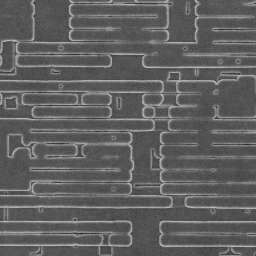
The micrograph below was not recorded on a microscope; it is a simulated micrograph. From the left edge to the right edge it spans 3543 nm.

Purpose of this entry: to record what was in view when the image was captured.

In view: wiring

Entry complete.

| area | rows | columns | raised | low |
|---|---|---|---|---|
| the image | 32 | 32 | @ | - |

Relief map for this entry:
@@@@-----@@@@@--@@@@@---@@@@@@@@
@@@@-----@@@@@@@@@@@@---@@@@@@@@
@@@@-----@@@@@@@@@@@@---@@@@@@@@
@@@@-----@@@@@@@@@@@@---@@@@@@@@
@@@@-----@@@@@@@@@@@@---@@@@@@@@
--@@@@@@@@@@@@@@@@@@@@@@@@@@@@@@
--@@@@@@@@@@@@@@@@@@@@@@@@@@@@@@
--@@@@@@@@@@@@----@@@@@@@@@@@@@@
--------------------------------
------------------------------@@
@@@@@@@@@@@@@@@@@@@@--@@@@@@@@@@
@@@@@@@@@@@@@@@@@@@@--@@@@@@@@@@
---@@@@@@@@@@@----@@--@@@@@@@@@@
----@@@@@@@@@@----@--@@@@@@@@@@@
----@@@@@@@@@@----@--@@@@@@@@@@@
@@@@@@@@@@@@@@@@@@@--@@@@@@@@@@@
@@@@@@@@@@@@@@@@@----@@@@@@@@@@@
@--@@@@@@@@@@@@@----@@@@@@@@@@@@
@-@@@@@@@@@@@@@@----@@@@@@@@@@@@
@@@@@@@@@@@@@@@@----@@@@@@@@@@@@
@@@@@@@@@@@@@@@@@---@@@@@@@@@@@@
@@@@@@@@@@@@@@@@----@@@@@@@@@@@@
@@@@@@@@@@@@@@@@----@@@@@@@@@@@@
@@@@@@@@@@@@@@@@----@@@@@@@@@@@@
@@@@@@@@@@@@@@@@@@@@@@-@@@@@@@@@
@@@@@@@@@@@@@@@@@@@@@@-@@@@@@@@@
--------------------------------
--------------------------------
@@@@@@@@@@@@@@@@----@@@@@@@@@@@@
@@@@@@@@@@@@@-@@----@@@@@@@@@@@@
@@@@@@@@@@@@@-@@----@@@@@@@@@@@@
--------------------------------